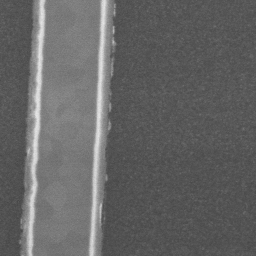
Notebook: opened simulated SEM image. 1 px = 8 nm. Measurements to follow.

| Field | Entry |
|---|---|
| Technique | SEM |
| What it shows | one or a few lines or trenches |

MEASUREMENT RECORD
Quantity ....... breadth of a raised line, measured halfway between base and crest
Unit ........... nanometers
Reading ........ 492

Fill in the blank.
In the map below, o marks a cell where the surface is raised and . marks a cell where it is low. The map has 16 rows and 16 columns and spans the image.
...ooo..........
...ooo..........
...ooo..........
...ooo..........
..oooo..........
..oooo..........
..oooo..........
..oooo..........
..oooo..........
..oooo..........
..oooo..........
..oooo..........
..oooo..........
..oooo..........
..oooo..........
..oooo..........